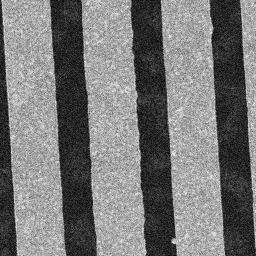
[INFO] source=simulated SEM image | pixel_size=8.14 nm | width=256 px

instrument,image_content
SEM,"one or a few lines or trenches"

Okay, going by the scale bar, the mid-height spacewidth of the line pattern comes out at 255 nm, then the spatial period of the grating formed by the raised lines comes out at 79.5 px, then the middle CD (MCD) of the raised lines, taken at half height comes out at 388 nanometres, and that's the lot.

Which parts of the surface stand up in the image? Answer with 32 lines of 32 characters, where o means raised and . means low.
oooooo....oooooo....oooooo....oo
oooooo....oooooo....oooooo....oo
oooooo....oooooo....oooooo....oo
oooooo....oooooo....ooooooo...oo
.ooooo....ooooooo...oooooo....oo
.ooooo.....oooooo...oooooo....oo
.oooooo....oooooo....oooooo....o
.oooooo....oooooo....oooooo....o
.oooooo....oooooo....oooooo....o
.oooooo....oooooo....oooooo....o
.oooooo....oooooo....oooooo....o
.oooooo....oooooo....oooooo....o
.oooooo....oooooo....oooooo....o
.oooooo....oooooo....oooooo....o
.oooooo....oooooo....oooooo....o
.oooooo....oooooo....oooooo....o
.oooooo....oooooo....oooooo....o
.oooooo....oooooo....oooooo....o
.oooooo....oooooo....oooooo....o
.oooooo....ooooooo...oooooo....o
..ooooo....oooooo....oooooo....o
..ooooo....oooooo....oooooo....o
..oooooo....oooooo...oooooo.....
..oooooo....oooooo....oooooo....
..oooooo....oooooo....oooooo....
..oooooo....oooooo....oooooo....
..oooooo....oooooo....oooooo....
..oooooo....oooooo....oooooo....
..oooooo....oooooo....oooooo....
..oooooo....oooooo....oooooo....
..oooooo....oooooo....oooooo....
..oooooo....oooooo....oooooo....